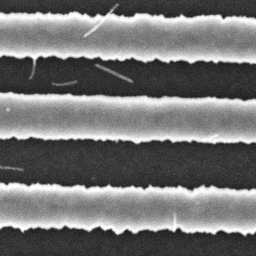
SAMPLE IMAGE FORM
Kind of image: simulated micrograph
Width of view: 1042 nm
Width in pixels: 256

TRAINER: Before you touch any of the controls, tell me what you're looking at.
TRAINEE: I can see lines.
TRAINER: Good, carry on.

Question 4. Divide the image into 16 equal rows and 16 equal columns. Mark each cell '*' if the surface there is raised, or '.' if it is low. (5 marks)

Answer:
................
****************
****************
.***************
................
................
****************
****************
****************
................
................
................
****************
****************
............*..*
................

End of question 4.